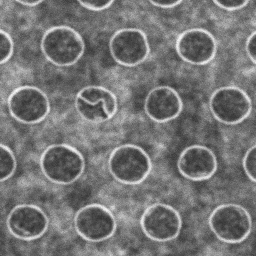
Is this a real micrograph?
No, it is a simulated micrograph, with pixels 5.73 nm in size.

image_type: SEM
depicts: a regular array of raised bodies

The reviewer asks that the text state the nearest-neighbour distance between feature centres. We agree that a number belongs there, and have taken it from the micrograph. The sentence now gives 382 nanometers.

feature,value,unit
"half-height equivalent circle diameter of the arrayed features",0.217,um